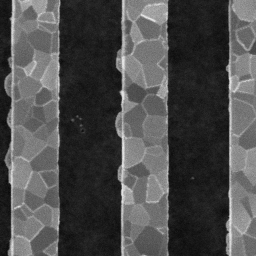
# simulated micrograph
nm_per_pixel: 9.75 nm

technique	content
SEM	lines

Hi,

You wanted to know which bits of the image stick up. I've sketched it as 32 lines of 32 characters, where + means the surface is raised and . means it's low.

..+++++........++++++........+++
..+++++........++++++........+++
.++++++........++++++........+++
.++++++........++++++........+++
.++++++........++++++........+++
.++++++........++++++........+++
.++++++........++++++........+++
.++++++........++++++........+++
..+++++........++++++........+++
..+++++........++++++........+++
.++++++........++++++........+++
.++++++........++++++........+++
.++++++........++++++........+++
.++++++........++++++........+++
.++++++........++++++........+++
.++++++........++++++........+++
.++++++........++++++........+++
.++++++........++++++........+++
.++++++........++++++........+++
.++++++........++++++........+++
.++++++........++++++........+++
.++++++........++++++........+++
.++++++........++++++........+++
.++++++........++++++........+++
.++++++........++++++........+++
.++++++........++++++........+++
.++++++........++++++........+++
.++++++........++++++........+++
.++++++........++++++........+++
.++++++........++++++........+++
.++++++........++++++........+++
.++++++........++++++........+++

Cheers